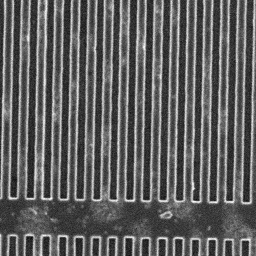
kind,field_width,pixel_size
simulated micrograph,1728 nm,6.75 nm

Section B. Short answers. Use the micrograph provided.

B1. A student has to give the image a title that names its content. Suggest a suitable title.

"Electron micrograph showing parallel lines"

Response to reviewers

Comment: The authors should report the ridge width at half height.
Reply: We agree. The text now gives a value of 60.7 nm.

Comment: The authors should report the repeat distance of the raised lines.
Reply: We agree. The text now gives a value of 112 nm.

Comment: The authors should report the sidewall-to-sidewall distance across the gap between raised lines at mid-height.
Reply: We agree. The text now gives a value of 54.8 nm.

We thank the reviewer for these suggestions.